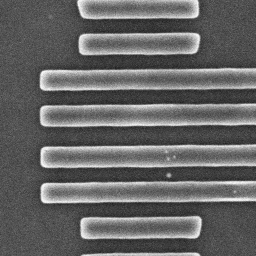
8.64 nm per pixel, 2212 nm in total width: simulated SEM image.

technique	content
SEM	wiring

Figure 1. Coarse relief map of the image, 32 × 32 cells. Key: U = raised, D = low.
DDDDDDDDDDUUUUUUUUUUUUUUUDDDDDDD
DDDDDDDDDDUUUUUUUUUUUUUUUDDDDDDD
DDDDDDDDDDDDDDDDDDDDDDDDDDDDDDDD
DDDDDDDDDDDDDDDDDDDDDDDDDDDDDDDD
DDDDDDDDDDUUUUUUUUUUUUUUUDDDDDDD
DDDDDDDDDDUUUUUUUUUUUUUUUDDDDDDD
DDDDDDDDDDUUUUUUUUUUUUUUDDDDDDDD
DDDDDDDDDDDDDDDDDDDDDDDDDDDDDDDD
DDDDDDDDDDDDDDDDDDDDDDDDDDDDDDDD
DDDDDUUUUUUUUUUUUUUUUUUUUUUUUUUU
DDDDDUUUUUUUUUUUUUUUUUUUUUUUUUUU
DDDDDDDDDDDDDDDDDDDDDDDDDDDDDDDD
DDDDDDDDDDDDDDDDDDDDDDDDDDDDDDDD
DDDDDUUUUUUUUUUUUUUUUUUUUUUUUUUU
DDDDDUUUUUUUUUUUUUUUUUUUUUUUUUUU
DDDDDUUUUUUUUUUUUUUUUUUUUUDDUUDD
DDDDDDDDDDDDDDDDDDDDDDDDDDDDDDDD
DDDDDDDDDDDDDDDDDDDDDDDDDDDDDDDD
DDDDDDUUUUUUUUUUUUUUUUUUUUUUUUUU
DDDDDUUUUUUUUUUUUUUUUUUUUUUUUUUU
DDDDDUUUUUUUUUUUUUUUUUUUUUUUUUUU
DDDDDDDDDDDDDDDDDDDDDDDDDDDDDDDD
DDDDDDDDDDDDDDDDDDDDDDDDDDDDDDDD
DDDDDUUUUUUUUUUUUUUUUUUUUUUUUUUU
DDDDDUUUUUUUUUUUUUUUUUUUUUUUUUUU
DDDDDDDDDDDDDDDDDDDDDDDDDDDDDDDD
DDDDDDDDDDDDDDDDDDDDDDDDDDDDDDDD
DDDDDDDDDDUUUUUUUUUUUUUUUDDDDDDD
DDDDDDDDDDUUUUUUUUUUUUUUUDDDDDDD
DDDDDDDDDDUUUUUUUUUUUUUUUDDDDDDD
DDDDDDDDDDDDDDDDDDDDDDDDDDDDDDDD
DDDDDDDDDDDDDDDDDDDDDDDDDDDDDDDD